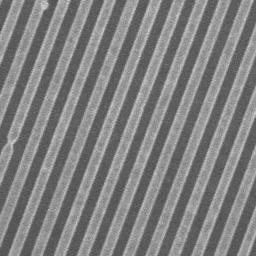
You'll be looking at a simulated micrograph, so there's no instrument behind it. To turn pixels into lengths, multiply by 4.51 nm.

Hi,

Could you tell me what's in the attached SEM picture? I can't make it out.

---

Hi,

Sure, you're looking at parallel lines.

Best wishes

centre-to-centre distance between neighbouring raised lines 96.6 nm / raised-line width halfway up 44.9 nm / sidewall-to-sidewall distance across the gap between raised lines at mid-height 53.8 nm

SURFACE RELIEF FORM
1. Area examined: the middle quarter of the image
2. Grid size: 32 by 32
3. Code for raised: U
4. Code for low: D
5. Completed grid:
UDDDUUUDDDUUDDDDUUDDDUUUDDDUUUDD
UDDDUUDDDUUUDDDUUUDDDUUUDDDUUDDD
DDDUUUDDDUUUDDDUUDDDDUUDDDUUUDDD
DDDUUUDDDUUDDDUUUDDDUUUDDDUUDDDD
DDDUUDDDUUUDDDUUUDDDUUDDDUUUDDDU
DDUUUDDDUUDDDDUUDDDUUUDDDUUUDDDU
DDUUDDDUUUDDDUUUDDDUUUDDDUUDDDUU
DUUUDDDUUUDDDUUDDDDUUDDDUUUDDDUU
DUUUDDDUUDDDUUUDDDUUUDDDUUUDDDUU
DUUDDDUUUDDDUUUDDDUUUDDDUUDDDUUU
UUUDDDUUUDDDUUDDDDUUDDDUUUDDDUUU
UUUDDDUUDDDUUUDDDUUUDDDUUDDDDUUD
UUDDDUUUDDDUUUDDDUUDDDUUUDDDUUUD
UUDDDUUDDDDUUDDDUUUDDDUUUDDDUUDD
UDDDUUUDDDUUUDDDUUUDDDUUDDDUUUDD
UDDDUUUDDDUUDDDDUUDDDUUUDDDUUUDD
UDDDUUDDDUUUDDDUUUDDDUUDDDDUUDDD
DDDUUUDDDUUUDDDUUUDDUUUDDDUUUDDD
DDDUUDDDDUUDDDDUUDDDUUUDDDUUUDDD
DDUUUDDDUUUDDDUUUDDDUUDDDDUUDDDU
DDUUUDDDUUUDDDUUDDDUUUDDDUUUDDDU
DDUUDDDDUUDDDUUUDDDUUUDDDUUDDDUU
DUUUDDDUUUDDDUUUDDDUUDDDUUUDDDUU
DUUUDDDUUDDDDUUDDDUUUDDDUUUDDDUU
DUUDDDUUUDDDUUUDDDUUDDDDUUDDDUUU
UUUDDDUUUDDDUUUDDUUUDDDUUUDDDUUD
UUDDDDUUDDDDUUDDDUUUDDDUUUDDUUUD
UUDDDUUUDDDUUUDDDUUDDDDUUDDDUUUD
UUDDDUUUDDDUUDDDUUUDDDUUUDDDUUDD
UDDDDUUDDDUUUDDDUUUDDDUUDDDUUUDD
UDDDUUUDDDUUUDDDUUDDDUUUDDDUUUDD
UDDDUUDDDDUUDDDUUUDDDUUUDDDUUDDD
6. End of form